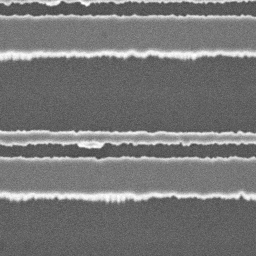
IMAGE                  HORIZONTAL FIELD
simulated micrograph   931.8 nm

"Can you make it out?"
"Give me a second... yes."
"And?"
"lines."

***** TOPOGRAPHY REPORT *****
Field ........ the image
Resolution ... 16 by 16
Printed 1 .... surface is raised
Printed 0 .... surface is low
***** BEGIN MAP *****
1111111111111111
1111111111111111
1111111111111111
0000000000000000
0000000000000000
0000000000000000
0000000000000000
0000000000000000
1111111111111111
1111111111111111
1111111111111111
1111111111111111
0000000000000000
0000000000000000
0000000000000000
0000000000000000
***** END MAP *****